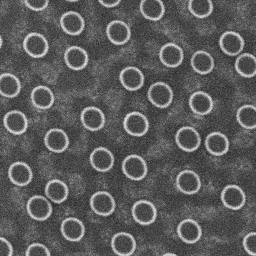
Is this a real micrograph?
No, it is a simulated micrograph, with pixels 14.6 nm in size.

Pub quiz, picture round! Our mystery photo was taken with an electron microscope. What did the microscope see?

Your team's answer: a regular array of raised bodies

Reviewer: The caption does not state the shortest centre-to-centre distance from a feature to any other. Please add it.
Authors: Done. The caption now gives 36.4 px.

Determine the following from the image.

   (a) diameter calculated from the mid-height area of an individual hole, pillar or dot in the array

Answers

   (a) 324 nm